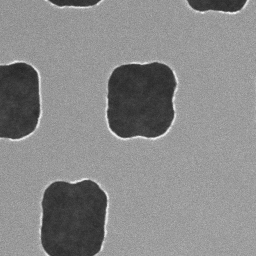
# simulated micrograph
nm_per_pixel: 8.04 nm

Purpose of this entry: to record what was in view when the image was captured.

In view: holes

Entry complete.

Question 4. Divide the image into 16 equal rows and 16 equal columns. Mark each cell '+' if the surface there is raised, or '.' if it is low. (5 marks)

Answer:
++++++++++++...+
++++++++++++++++
++++++++++++++++
++++++++++++++++
..+++++....+++++
..+++++....+++++
..+++++....+++++
..+++++....+++++
..++++++..++++++
++++++++++++++++
++++++++++++++++
+++...++++++++++
+++....+++++++++
+++....+++++++++
+++....+++++++++
+++...++++++++++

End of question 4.